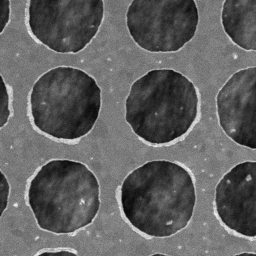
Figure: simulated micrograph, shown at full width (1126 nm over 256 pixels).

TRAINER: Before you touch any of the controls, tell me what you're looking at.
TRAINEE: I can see holes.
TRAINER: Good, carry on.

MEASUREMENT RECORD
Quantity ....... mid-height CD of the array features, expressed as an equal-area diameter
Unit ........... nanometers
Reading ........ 322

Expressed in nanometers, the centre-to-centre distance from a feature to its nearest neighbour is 409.